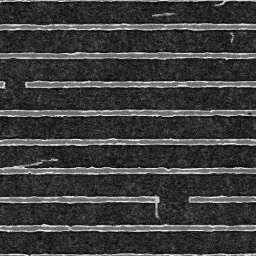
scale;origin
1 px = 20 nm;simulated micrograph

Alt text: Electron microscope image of parallel lines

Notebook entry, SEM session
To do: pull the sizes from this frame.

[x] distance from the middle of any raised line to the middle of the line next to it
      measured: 0.574 micrometres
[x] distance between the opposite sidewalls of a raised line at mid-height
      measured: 110 nm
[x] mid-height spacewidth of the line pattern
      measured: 0.457 microns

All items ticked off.